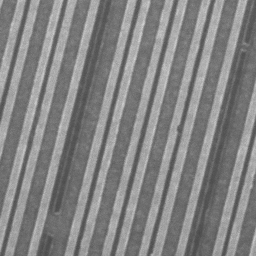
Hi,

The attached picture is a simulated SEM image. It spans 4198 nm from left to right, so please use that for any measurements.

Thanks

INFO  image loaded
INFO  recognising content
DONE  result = parallel lines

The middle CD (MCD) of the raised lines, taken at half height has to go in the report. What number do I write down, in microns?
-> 0.113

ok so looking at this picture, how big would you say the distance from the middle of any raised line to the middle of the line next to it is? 292 nm